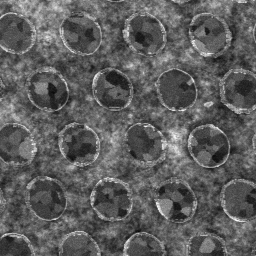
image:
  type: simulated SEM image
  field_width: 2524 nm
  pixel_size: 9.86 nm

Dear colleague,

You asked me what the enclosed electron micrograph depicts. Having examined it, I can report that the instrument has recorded a regular array of raised bodies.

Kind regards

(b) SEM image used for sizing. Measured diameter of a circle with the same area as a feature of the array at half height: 420 nm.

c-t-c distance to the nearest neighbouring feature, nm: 625